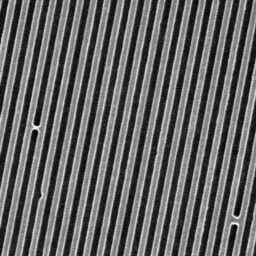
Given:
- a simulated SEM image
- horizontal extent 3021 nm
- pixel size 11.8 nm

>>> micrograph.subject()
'parallel lines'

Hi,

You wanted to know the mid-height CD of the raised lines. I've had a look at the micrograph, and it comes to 75.3 nm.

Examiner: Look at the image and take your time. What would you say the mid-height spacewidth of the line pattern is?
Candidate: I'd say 0.087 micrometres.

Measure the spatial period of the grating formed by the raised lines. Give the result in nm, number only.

157